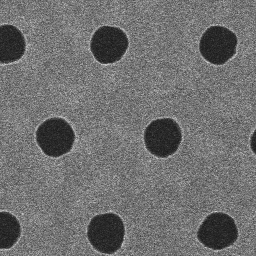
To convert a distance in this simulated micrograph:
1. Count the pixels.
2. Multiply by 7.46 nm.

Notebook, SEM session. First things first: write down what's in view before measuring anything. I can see holes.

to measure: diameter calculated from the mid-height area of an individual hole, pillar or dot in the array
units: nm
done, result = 283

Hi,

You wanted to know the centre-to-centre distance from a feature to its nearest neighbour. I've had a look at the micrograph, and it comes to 0.801 micrometres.